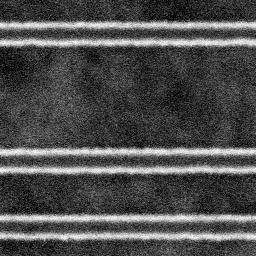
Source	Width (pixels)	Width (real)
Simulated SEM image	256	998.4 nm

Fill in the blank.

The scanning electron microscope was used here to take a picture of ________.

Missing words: lines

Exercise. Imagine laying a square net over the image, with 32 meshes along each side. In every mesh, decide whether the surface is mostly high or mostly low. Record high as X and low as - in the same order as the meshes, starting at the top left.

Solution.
--------------------------------
--------------------------------
--------------------------------
XXXXXXXXXXXXXXXXXXXXXXXXXXXXXXXX
XXXXXXXXXXXXXXXXXXXXXXXXXXXXXXXX
XXX--XXXXX-XXXXXXXXXXXXXXXXXX--X
--------------------------------
--------------------------------
--------------------------------
--------------------------------
--------------------------------
--------------------------------
--------------------------------
--------------------------------
--------------------------------
--------------------------------
--------------------------------
--------------------------------
--------------------------------
XXXXXXXXXXXXXXXXXXXXXXXXXXXXXXXX
XXXXXXXXXXXXXXXXXXXXXXXXXXXXXXXX
X--X---XXX-XXX--X-X-X--------X--
--------------------------------
--------------------------------
--------------------------------
--------------------------------
--------------------------------
XXXXXXXXXXXXXXXXXXXXXXXXXXXXXXXX
XXXXXXXXXXXXXXXXXXXXXXXXXXXXXXXX
XXXXXXXXXXXXXXXXXXXXXXXXXXXXXXXX
--------------------------------
--------------------------------